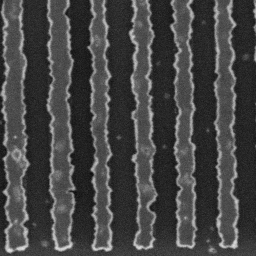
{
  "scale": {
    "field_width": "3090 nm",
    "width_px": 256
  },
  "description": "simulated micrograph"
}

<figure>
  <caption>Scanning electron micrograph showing parallel lines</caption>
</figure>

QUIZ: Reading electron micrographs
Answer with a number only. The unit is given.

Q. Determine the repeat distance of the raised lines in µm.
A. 0.509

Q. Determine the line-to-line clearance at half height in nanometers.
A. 302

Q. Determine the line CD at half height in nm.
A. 205